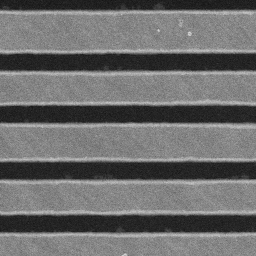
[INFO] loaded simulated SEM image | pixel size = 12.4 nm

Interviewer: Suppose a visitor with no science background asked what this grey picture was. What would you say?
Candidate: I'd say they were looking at lines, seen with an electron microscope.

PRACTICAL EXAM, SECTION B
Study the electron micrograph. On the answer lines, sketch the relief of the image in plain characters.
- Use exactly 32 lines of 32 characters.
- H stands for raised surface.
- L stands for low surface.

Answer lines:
LLLLLLLLLLLLLLLLLLLLLLLLLLLLLLLL
HHHHHHHHHHHHHHHHHHHHHHHHHHHHHHHH
HHHHHHHHHHHHHHHHHHHHHHHHHHHHHHHH
HHHHHHHHHHHHHHHHHHHHHHHHHHHHHHHH
HHHHHHHHHHHHHHHHHHHHHHHHHHHHHHHH
HHHHHHHHHHHHHHHHHHHHHHHHHHHHHHHH
HHHHHHHHHHHHHHHHHHHHHHHHHHHHHHHH
LLLLLLLLLLLLLLLLLLLLLLLLLLLLLLLL
LLLLLLLLLLLLLLLLLLLLLLLLLLLLLLLL
HHHHHHHHHHHHHHHHHHHHHHHHHHHHHHHH
HHHHHHHHHHHHHHHHHHHHHHHHHHHHHHHH
HHHHHHHHHHHHHHHHHHHHHHHHHHHHHHHH
HHHHHHHHHHHHHHHHHHHHHHHHHHHHHHHH
LLLLLLLLLLLLLLLLLLLLLLLLLLLLLLLL
LLLLLLLLLLLLLLLLLLLLLLLLLLLLLLLL
HHHHHHHHHHHHHHHHHHHHHHHHHHHHHHHH
HHHHHHHHHHHHHHHHHHHHHHHHHHHHHHHH
HHHHHHHHHHHHHHHHHHHHHHHHHHHHHHHH
HHHHHHHHHHHHHHHHHHHHHHHHHHHHHHHH
HHHHHHHHHHHHHHHHHHHHHHHHHHHHHHHH
LLLLLLLLLLLLLLLLLLLLLLLLLLLLLLLL
LLLLLLLLLLLLLLLLLLLLLLLLLLLLLLLL
HHHLLHHHHHHLHHHHHHHHHHHLHHHHHHHH
HHHHHHHHHHHHHHHHHHHHHHHHHHHHHHHH
HHHHHHHHHHHHHHHHHHHHHHHHHHHHHHHH
HHHHHHHHHHHHHHHHHHHHHHHHHHHHHHHH
HHHHHHHHHHHHHHHHHHHHHHHHHHHHHHHH
LLLLLLLLLLLLLLLLLLLLLLLLLLLLLLLL
LLLLLLLLLLLLLLLLLLLLLLLLLLLLLLLL
HHHHHHHHHHHHHHHHHHHHHHHHHHHHHHHH
HHHHHHHHHHHHHHHHHHHHHHHHHHHHHHHH
HHHHHHHHHHHHHHHHHHHHHHHHHHHHHHHH